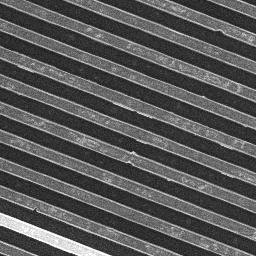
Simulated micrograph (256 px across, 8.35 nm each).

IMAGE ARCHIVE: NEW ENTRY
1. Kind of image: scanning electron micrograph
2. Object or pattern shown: parallel lines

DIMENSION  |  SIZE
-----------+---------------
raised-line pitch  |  0.216 µm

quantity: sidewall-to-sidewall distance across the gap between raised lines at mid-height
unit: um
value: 0.125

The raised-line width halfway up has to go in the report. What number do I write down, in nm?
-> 92.4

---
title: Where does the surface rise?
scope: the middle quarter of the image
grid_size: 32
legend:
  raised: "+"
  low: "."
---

.......++++++++..........+++++++
.........++++++++..........+++++
++..........+++++++...........++
+++++..........+++++++..........
+++++++..........++++++++.......
..++++++++..........++++++++....
....++++++++...........+++++++..
.......++++++++..........+++++++
..........+++++++..........+++++
++..........++++++++..........++
+++++.........+++++++++.........
+++++++..........++++++++.......
..+++++++...........++++++++....
.....+++++++..........++++++++..
.......++++++++..........+++++++
.........+++++++++..........++++
++..........++++++++...........+
+++++..........++++++++.........
+++++++..........++++++++.......
..+++++++...........++++++++....
....++++++++..........++++++++..
.......++++++++...........++++++
.........+++++++++..........++++
++..........++++++++...........+
+++++..........++++++++.........
+++++++...........+++++++.......
..++++++++..........++++++++....
.....++++++++..........++++++++.
........+++++++..........+++++++
..........++++++++..........++++
++...........+++++++...........+
+++++..........++++++++.........